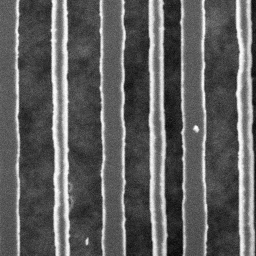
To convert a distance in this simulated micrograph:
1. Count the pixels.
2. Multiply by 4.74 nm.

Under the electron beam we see lines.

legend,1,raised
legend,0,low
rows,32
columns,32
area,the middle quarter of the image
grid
10000000011111100000001110000111
10000000011111100000001110000111
10000000011111100000001110000111
10000000011111100000001110000111
10000000011111100000001110000111
10000000011111100000001110000111
10000000011111100000001110000111
10000000011111100000001110000111
10000000011111100000001110000111
10000000011111100000001110000111
10000000001111100000001110000111
10000000011111100000001110000111
10000000011111100000001110000011
10000000011111100000001110000011
10000000011111100000001110000011
10000000001111100000001110000011
10000000001111100000001110000011
10000000001111100000001110000111
10000000001111100000001110000011
10000000001111100000001110000011
10000000001111100000001110000011
10000000001111100000001110000011
10000000001111100000001110000011
10000000001111100000001110000011
10000000001111100000001110000011
10000000001111100000001110000011
10000000001111100000001110000011
10000000011111100000001110000011
10000000001111100000001110000011
10000000001111100000001110000011
10000000001111100000001110000011
10000000001111100000001110000011